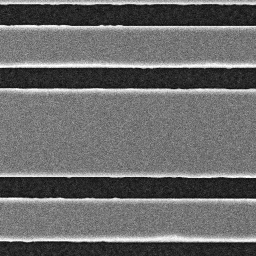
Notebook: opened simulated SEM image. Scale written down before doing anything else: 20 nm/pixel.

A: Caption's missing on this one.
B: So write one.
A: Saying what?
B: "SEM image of lines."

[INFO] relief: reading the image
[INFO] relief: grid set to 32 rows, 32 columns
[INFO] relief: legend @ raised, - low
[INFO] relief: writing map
----------@@--@@---------------@
--------------------------------
--------------------------------
@@@@@@@@@@@@@@@@@@@@@@@@@@@@@@@@
@@@@@@@@@@@@@@@@@@@@@@@@@@@@@@@@
@@@@@@@@@@@@@@@@@@@@@@@@@@@@@@@@
@@@@@@@@@@@@@@@@@@@@@@@@@@@@@@@@
@@@@@@@@@@@@@@@@@@@@@@@@@@@@@@@@
--------------------------------
--------------------------------
--------------------------------
@@@@@@@@@@@@@@@@@@@@@@@@@@@@@@@@
@@@@@@@@@@@@@@@@@@@@@@@@@@@@@@@@
@@@@@@@@@@@@@@@@@@@@@@@@@@@@@@@@
@@@@@@@@@@@@@@@@@@@@@@@@@@@@@@@@
@@@@@@@@@@@@@@@@@@@@@@@@@@@@@@@@
@@@@@@@@@@@@@@@@@@@@@@@@@@@@@@@@
@@@@@@@@@@@@@@@@@@@@@@@@@@@@@@@@
@@@@@@@@@@@@@@@@@@@@@@@@@@@@@@@@
@@@@@@@@@@@@@@@@@@@@@@@@@@@@@@@@
@@@@@@@@@@@@@@@@@@@@@@@@@@@@@@@@
@@@@@@@@@@@@@@@@@@@@@@@@@@@@@@@@
--------------------------------
--------------------------------
--------------------------------
@@@@@@@@@@@@@@@@@@@@@@@@@@@@@@@@
@@@@@@@@@@@@@@@@@@@@@@@@@@@@@@@@
@@@@@@@@@@@@@@@@@@@@@@@@@@@@@@@@
@@@@@@@@@@@@@@@@@@@@@@@@@@@@@@@@
@@@@@@@@@@@@@@@@@@@@@@@@@@@@@@@@
--------------------------------
--------------------------------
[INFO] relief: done